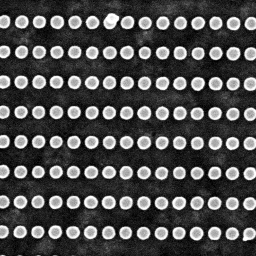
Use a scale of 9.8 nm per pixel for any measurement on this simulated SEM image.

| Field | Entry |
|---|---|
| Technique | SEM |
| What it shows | a regular array of raised bodies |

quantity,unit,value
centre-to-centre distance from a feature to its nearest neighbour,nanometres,171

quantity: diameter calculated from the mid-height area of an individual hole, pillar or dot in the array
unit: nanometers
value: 120